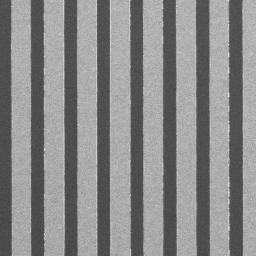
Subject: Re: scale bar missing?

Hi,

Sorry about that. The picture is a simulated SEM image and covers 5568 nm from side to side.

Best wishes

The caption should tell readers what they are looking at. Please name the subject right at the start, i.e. parallel lines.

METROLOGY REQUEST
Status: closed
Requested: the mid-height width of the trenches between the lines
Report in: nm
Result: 302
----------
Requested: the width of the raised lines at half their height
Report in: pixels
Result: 19.2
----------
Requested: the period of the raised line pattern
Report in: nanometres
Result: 718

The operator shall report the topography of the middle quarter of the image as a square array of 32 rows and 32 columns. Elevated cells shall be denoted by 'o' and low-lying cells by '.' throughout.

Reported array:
....oooo....oooo....ooooo...oooo
....oooo....oooo....ooooo...oooo
....oooo....oooo....ooooo...oooo
....oooo....oooo....ooooo...oooo
....oooo....oooo....ooooo...oooo
....oooo....oooo....ooooo...oooo
....oooo....oooo....ooooo...oooo
....oooo....oooo....ooooo...oooo
....oooo....oooo....ooooo...oooo
....oooo....oooo....ooooo...oooo
....oooo....oooo....ooooo...oooo
....oooo....oooo....ooooo...oooo
....oooo....oooo....ooooo...oooo
....oooo....oooo....ooooo...oooo
....oooo....oooo....ooooo...oooo
....oooo....oooo....ooooo...oooo
....oooo....oooo....ooooo...oooo
....oooo....oooo....ooooo...oooo
....oooo....ooooo...ooooo...oooo
....oooo....oooo....ooooo...oooo
....oooo....oooo....ooooo...oooo
....oooo....oooo....ooooo...oooo
....oooo....oooo....ooooo...oooo
....oooo....oooo....ooooo...oooo
....oooo....oooo....ooooo...oooo
....oooo....oooo....ooooo...oooo
....oooo....oooo....ooooo...oooo
....oooo....oooo....ooooo...oooo
....oooo....oooo....ooooo...oooo
....oooo....oooo....ooooo...oooo
....oooo....oooo....ooooo...oooo
....oooo....oooo....ooooo...oooo